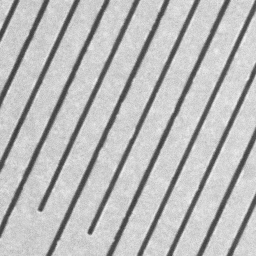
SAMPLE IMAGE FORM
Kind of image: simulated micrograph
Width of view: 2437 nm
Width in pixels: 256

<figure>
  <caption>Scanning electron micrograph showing parallel lines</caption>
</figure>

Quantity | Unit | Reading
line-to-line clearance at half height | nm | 59.4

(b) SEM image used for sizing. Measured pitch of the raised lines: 260 nanometers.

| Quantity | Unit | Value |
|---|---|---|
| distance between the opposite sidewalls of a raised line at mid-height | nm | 199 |